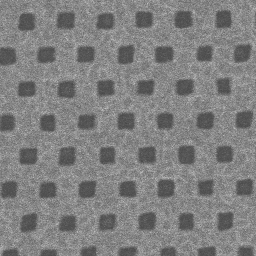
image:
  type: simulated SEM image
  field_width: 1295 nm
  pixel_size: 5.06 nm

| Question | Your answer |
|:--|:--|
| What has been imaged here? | a regular array of holes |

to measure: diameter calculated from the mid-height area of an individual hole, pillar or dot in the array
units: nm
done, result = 98.5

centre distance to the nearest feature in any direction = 194 nm